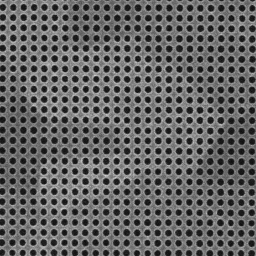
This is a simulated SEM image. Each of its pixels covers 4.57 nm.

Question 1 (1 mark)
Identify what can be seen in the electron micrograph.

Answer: a regular array of holes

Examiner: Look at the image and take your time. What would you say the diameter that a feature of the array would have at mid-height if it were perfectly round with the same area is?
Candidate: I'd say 32.6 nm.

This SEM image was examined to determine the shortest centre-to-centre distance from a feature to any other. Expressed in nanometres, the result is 45.4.